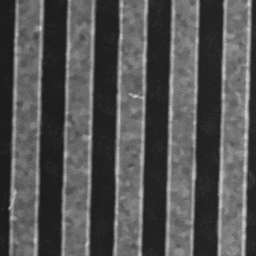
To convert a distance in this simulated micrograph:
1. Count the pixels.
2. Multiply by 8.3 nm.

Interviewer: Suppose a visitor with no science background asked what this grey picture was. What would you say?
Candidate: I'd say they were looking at parallel lines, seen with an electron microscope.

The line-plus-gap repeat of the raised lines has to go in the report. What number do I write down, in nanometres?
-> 432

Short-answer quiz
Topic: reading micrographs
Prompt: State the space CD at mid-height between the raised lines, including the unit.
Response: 229 nanometres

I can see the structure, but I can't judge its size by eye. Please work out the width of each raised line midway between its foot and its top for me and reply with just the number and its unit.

0.205 µm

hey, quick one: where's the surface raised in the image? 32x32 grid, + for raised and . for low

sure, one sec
..+++....+++...+++....+++...+++.
..+++....+++...+++....+++...+++.
..+++....+++...+++....+++...+++.
..+++....+++...+++....+++...+++.
..+++....+++...+++....+++...+++.
..+++....+++...+++....+++...+++.
..+++....+++...+++....+++...+++.
..+++....+++...+++....++....+++.
..+++....++....+++...+++....+++.
..+++...+++....+++...+++....+++.
..+++...+++....+++...++++...+++.
..+++...+++....+++...+++....+++.
..+++...+++....+++...+++....+++.
..+++...+++....+++...+++....+++.
..+++...+++....+++...+++....+++.
..+++...+++....+++...+++....+++.
..+++...+++....+++...+++....+++.
..+++...+++....+++...+++....+++.
..+++...+++....+++...+++....+++.
..+++...+++....+++...+++....+++.
..+++...+++....+++...+++....+++.
..+++...+++....+++...+++....+++.
..+++...+++....+++...+++....+++.
..+++...+++....+++...+++....+++.
..+++...+++....+++...+++....++..
.++++...+++....+++...+++....+++.
.+++....+++....+++...+++....+++.
.+++....+++....+++...+++....+++.
.+++....+++....+++...+++....+++.
.++++...+++....+++...+++....++..
.+++....+++....++....+++...+++..
.+++....+++...+++....+++...+++..